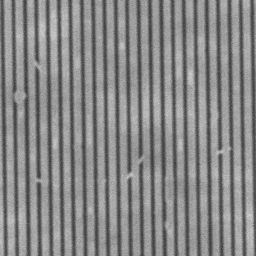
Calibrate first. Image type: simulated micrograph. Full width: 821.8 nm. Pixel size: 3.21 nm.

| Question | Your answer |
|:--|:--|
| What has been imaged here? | parallel lines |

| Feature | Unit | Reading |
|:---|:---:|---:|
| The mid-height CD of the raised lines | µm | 0.0225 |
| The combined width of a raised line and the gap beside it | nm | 36.5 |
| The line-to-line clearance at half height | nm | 14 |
